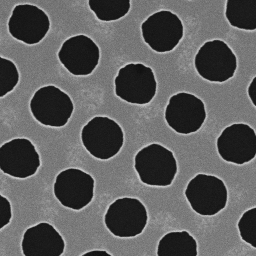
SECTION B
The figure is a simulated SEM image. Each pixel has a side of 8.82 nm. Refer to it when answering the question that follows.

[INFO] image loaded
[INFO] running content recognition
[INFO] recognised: a regular array of holes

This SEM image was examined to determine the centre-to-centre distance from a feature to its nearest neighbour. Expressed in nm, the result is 516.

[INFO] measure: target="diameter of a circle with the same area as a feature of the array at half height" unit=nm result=360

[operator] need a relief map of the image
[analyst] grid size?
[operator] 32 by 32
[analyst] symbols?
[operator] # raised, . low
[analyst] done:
###########.....############....
##...#######....####.#######....
#.....#######.####....#######...
#.....############.....#######..
##....####.#######.....#########
########....######....####..####
#######.....#############....###
.#######....############......##
..######....###....######....###
..#############....######....###
..############......###########.
.####...######.....############.
####.....#######...##....######.
####.....############.....######
####.....############.....######
#####...###....######....#######
##########.....#######..####....
##.#######.....############.....
....#######....###...######.....
.....#######..###.....######....
.....############.....##########
....####..#######.....##########
#######.....######....##....####
#######.....###########.....####
#######.....###########.....####
.#######...###....######....####
.############.....#######..####.
.############.....############..
####...######.....############..
###.....#######..####...######..
###.....############.....######.
###.....###..#######.....#######